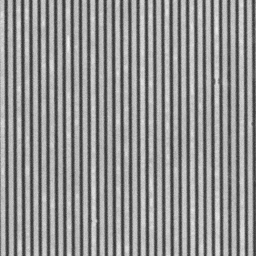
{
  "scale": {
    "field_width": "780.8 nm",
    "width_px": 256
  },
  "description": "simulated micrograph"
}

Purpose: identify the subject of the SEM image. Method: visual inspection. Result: parallel lines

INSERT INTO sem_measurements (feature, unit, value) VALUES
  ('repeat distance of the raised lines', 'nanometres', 25.2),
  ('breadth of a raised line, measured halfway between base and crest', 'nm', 13.4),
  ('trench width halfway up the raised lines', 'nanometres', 13.4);